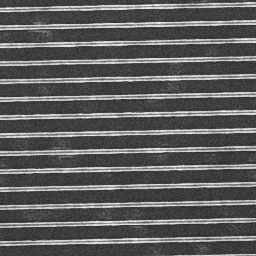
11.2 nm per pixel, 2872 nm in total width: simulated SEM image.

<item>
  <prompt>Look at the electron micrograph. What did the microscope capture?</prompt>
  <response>parallel lines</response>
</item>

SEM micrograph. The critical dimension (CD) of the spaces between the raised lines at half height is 161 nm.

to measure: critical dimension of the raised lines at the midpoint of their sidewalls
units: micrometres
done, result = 0.0379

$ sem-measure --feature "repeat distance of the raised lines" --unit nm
202